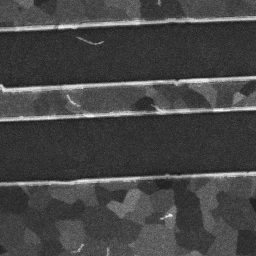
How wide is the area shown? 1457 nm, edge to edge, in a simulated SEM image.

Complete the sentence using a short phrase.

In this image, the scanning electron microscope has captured one or a few lines or trenches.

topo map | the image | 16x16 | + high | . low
++++++++++++++++
+++++++.........
................
................
................
...+++++++++++++
++++++++++++++++
................
................
................
................
.+++++++++++++++
++++++++++++++++
++++++++++++++++
++++++++++++++++
++++++++++++++++